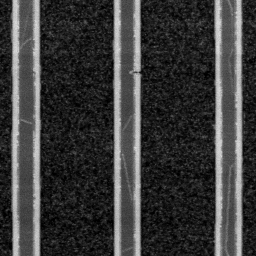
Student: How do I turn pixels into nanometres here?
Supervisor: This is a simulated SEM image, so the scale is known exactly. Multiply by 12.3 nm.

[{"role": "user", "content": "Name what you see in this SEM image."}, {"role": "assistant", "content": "one or a few lines or trenches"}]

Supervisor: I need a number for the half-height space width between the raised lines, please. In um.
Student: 0.991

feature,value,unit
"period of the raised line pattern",1.25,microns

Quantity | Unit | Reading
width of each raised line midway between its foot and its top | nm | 251